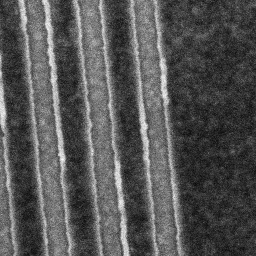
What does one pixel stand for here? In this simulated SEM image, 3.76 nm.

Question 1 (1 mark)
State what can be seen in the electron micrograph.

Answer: parallel lines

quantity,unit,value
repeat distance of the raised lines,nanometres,206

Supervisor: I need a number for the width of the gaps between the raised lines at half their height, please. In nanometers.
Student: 78.6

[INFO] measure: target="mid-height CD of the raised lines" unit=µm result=0.124